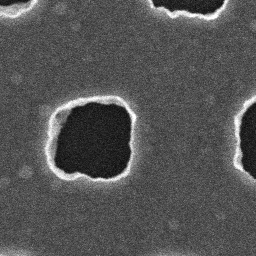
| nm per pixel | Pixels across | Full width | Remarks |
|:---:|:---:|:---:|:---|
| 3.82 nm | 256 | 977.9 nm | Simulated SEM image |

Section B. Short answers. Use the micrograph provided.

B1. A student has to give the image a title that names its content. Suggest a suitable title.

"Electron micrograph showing holes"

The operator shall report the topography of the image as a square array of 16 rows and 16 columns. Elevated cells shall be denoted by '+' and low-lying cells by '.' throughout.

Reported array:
..++++++++....++
++++++++++++++++
++++++++++++++++
++++++++++++++++
++++++++++++++++
++++++++++++++++
+++++..+++++++++
+++.....+++++++.
+++.....+++++++.
+++.....+++++++.
++++....+++++++.
++++++++++++++++
++++++++++++++++
++++++++++++++++
++++++++++++++++
++++++++++++++++